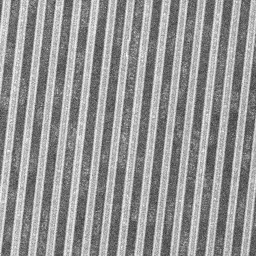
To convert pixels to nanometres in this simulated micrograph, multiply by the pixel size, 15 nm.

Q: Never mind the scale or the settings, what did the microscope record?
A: parallel lines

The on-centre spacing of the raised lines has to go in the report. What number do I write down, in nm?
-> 264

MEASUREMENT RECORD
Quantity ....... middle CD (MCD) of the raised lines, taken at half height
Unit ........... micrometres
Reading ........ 0.0986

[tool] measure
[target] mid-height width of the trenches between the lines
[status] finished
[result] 162 nanometers